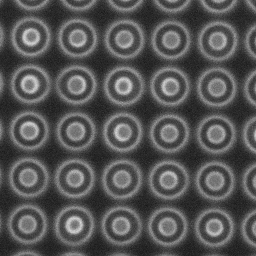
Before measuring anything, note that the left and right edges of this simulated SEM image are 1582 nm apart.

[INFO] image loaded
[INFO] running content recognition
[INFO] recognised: an array of small figures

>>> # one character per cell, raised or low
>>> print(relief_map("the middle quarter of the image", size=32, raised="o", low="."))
oooooooooooooooooooooooooooooooo
o....ooooooooo..ooooooooo..ooooo
......oooooo......oooooo.....ooo
..oo...oooo........oooo.......oo
.oooo..oooo...oo...ooo...ooo...o
.oooo...ooo..oooo...oo...oooo..o
.oooo..oooo..ooo...ooo...oooo..o
.......oooo........oooo...o...oo
......oooooo......oooooo......oo
oo..ooooooooo....oooooooo...oooo
oooooooooooooooooooooooooooooooo
oooooooooooooooooooooooooooooooo
oooooooooooooooooooooooooooooooo
o....ooooooo.....oooooooo...oooo
......ooooo.......ooooo......ooo
.oooo..oooo...oo...oooo..oo...oo
.oooo..ooo...oooo..ooo...ooo...o
.oooo..oooo..oooo..ooo..oooo...o
..ooo..oooo...oo...ooo...ooo..oo
......ooooo.......ooooo.......oo
o....ooooooo.....ooooooo.....ooo
oooooooooooooo.ooooooooooooooooo
oooooooooooooooooooooooooooooooo
oooooooooooooooooooooooooooooooo
oo.ooooooooooooooooooooooooooooo
.....ooooooo.....ooooooo....oooo
......ooooo.......ooooo.......oo
.ooo...oooo..ooo...ooo...oo...oo
.oooo..ooo...ooo...ooo..oooo...o
.oooo..ooo...ooo...ooo..oooo...o
..oo..ooooo..ooo...ooo...ooo..oo
......ooooo.......ooooo.......oo